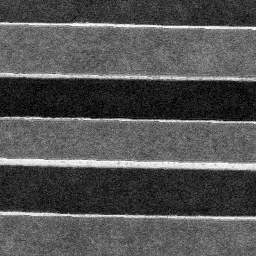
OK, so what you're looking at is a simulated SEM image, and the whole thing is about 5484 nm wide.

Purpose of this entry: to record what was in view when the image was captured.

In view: lines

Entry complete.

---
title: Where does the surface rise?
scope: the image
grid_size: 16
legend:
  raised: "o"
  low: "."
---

................
................
oooooooooooooooo
oooooooooooooooo
oooooooooooooooo
................
................
oooooo..........
oooooooooooooooo
oooooooooooooooo
................
................
................
ooooo...........
oooooooooooooooo
oooooooooooooooo